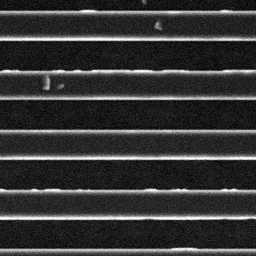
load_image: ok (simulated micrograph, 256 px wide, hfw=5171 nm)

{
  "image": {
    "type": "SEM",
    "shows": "lines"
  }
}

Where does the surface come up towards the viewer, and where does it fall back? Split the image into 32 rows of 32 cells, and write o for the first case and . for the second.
................................
oooooooooooooooooooooooooooooooo
oooooooooooooooooooooooooooooooo
oooooooooooooooooooooooooooooooo
oooooooooooooooooooooooooooooooo
................................
................................
................................
................................
oooooooooooooooooooooooooooooooo
oooooooooooooooooooooooooooooooo
oooooooooooooooooooooooooooooooo
................................
................................
................................
................................
oooooooooooooooooooooooooooooooo
oooooooooooooooooooooooooooooooo
oooooooooooooooooooooooooooooooo
oooooooooooooooooooooooooooooooo
................................
................................
................................
................................
oooooooooooooooooooooooooooooooo
oooooooooooooooooooooooooooooooo
oooooooooooooooooooooooooooooooo
................................
................................
................................
................................
oooooooooooooooooooooooooooooooo